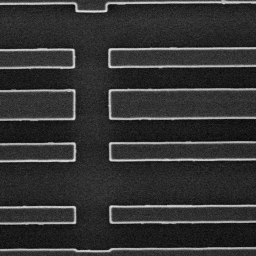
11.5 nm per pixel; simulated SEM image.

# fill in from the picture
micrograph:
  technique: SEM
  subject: groups of lines, slits or small figures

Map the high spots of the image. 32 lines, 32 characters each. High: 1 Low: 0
00000000011111000000000000000000
00000000000000000000000000000000
00000000000000000000000000000000
00000000000000000000000000000000
00000000000000000000000000000000
00000000000000000000000000000000
11111111100000111111111111111111
11111111100000111111111111111111
11100000000000000000000000000000
00000000000000000000000000000000
00000000000000000000000000000000
11111111100000111111111111111111
11111111100000111111111111111111
11111111100000111111111111111111
11111111100000111111111111111111
00000000000000000000000000000000
00000000000000000000000000000000
00000000000000000000000000000000
11111111100000111111111111111111
11111111100000111111111111111111
00000000000000000000000000000000
00000000000000000000000000000000
00000000000000000000000000000000
00000000000000000000000000000000
00000000000000000000000000000000
00000000000000000000000000000000
11111111100000111111111111111111
11111111100000111111111111111111
00000000000000000000000000000000
00000000000000000000000000000000
00000000000000000000000000000000
11111111111111111111111111111111